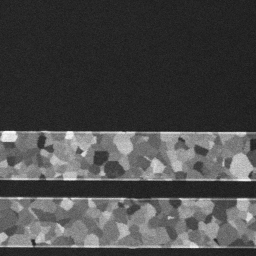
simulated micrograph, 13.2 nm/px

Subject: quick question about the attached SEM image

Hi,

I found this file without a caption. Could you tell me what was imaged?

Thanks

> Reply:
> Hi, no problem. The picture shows one or a few lines or trenches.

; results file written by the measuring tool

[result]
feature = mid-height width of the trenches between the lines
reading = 248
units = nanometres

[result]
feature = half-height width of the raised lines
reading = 0.639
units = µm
